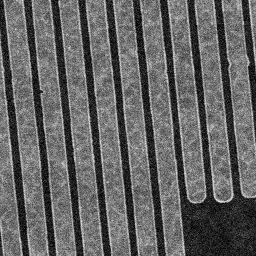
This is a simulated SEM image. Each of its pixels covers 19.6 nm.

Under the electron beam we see parallel lines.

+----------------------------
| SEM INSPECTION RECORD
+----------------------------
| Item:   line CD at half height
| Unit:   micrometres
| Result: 0.358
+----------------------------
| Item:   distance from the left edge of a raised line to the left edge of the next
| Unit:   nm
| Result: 529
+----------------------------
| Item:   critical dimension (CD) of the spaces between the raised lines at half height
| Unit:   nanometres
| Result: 170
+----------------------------